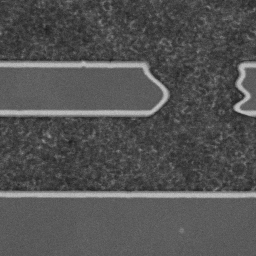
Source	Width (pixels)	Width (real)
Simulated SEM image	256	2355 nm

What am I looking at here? one or a few lines or trenches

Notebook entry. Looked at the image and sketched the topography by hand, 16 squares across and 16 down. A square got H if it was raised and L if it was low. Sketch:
LLLLLLLLLLLLLLLL
LLLLLLLLLLLLLLLL
LLLLLLLLLLLLLLLL
LLLLLLLLLLLLLLLL
HHHHHHHHHLLLLLLH
HHHHHHHHHHLLLLLH
HHHHHHHHHHLLLLLH
LLLLLLLLLLLLLLLL
LLLLLLLLLLLLLLLL
LLLLLLLLLLLLLLLL
LLLLLLLLLLLLLLLL
LLLLLLLLLLLLLLLL
HHHHHHHHHHHHHHHH
HHHHHHHHHHHHHHHH
HHHHHHHHHHHHHHHH
HHHHHHHHHHHHHHHH